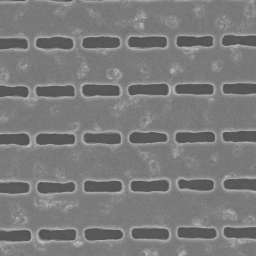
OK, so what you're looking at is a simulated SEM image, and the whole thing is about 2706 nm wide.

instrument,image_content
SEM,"a regular array of holes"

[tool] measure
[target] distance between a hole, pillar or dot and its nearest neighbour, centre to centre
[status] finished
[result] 490 nm